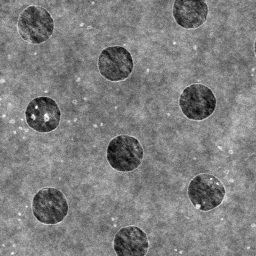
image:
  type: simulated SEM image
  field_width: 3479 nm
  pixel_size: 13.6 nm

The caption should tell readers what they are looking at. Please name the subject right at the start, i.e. holes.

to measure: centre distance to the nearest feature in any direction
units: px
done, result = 88.9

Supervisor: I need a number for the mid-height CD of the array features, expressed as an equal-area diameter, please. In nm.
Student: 499